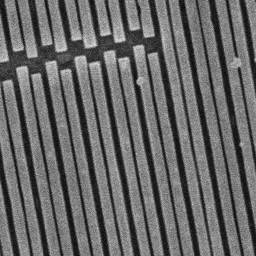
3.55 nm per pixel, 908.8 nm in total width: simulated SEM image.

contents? parallel lines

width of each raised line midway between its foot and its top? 36.8 nanometres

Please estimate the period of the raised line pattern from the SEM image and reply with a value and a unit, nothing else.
52.5 nm